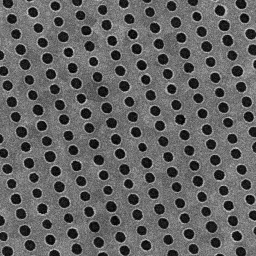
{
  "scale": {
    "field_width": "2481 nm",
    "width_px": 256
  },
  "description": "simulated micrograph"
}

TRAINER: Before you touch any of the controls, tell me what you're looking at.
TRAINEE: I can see a regular array of holes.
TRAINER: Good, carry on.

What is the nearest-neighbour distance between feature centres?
151 nanometers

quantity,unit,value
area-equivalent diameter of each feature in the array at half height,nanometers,105